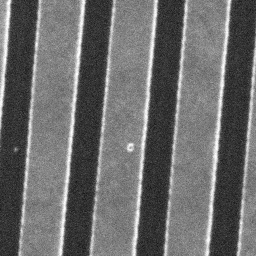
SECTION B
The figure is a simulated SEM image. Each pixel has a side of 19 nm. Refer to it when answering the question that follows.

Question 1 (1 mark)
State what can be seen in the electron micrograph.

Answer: lines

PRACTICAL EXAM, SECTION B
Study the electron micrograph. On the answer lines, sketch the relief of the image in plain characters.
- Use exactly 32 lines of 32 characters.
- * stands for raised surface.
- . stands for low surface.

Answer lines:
*....*****....******...******...
*....*****....******...******...
*....*****....*****....******...
*....*****....*****....*****....
*....*****....*****....*****....
*...******....*****....*****....
*...******....*****....*****....
*...******....*****....*****....
*...******...******....*****....
....******...******....*****....
....******...******...******....
....******...******...******...*
....*****....******...******...*
....*****....*****....******...*
....*****....*****....******...*
....*****....*****....*****....*
....*****....*****....*****....*
....*****....*****....*****....*
...******....*****....*****....*
...******...******....*****....*
...******...******...******....*
...******...******...******....*
...******...******...******....*
...*****....******...******...**
...*****....*****....******...**
...*****....*****....******...**
...*****....*****....*****....**
...*****....*****....*****....**
...*****....*****....*****....**
...*****...******....*****....**
...*****...******....*****....**
..******...******....*****....**